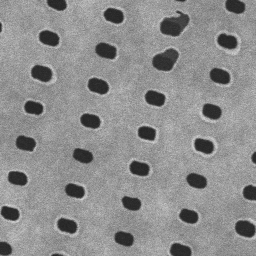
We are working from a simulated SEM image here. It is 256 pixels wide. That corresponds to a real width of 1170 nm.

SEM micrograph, a regular array of holes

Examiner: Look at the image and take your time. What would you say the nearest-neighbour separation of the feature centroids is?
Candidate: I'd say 163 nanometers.